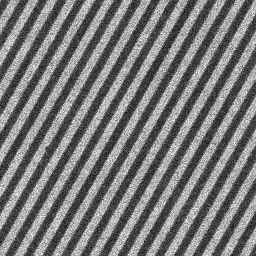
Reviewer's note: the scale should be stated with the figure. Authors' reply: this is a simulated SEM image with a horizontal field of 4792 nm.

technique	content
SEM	parallel lines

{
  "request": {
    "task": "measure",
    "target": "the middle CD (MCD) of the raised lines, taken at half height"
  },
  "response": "0.167 micrometres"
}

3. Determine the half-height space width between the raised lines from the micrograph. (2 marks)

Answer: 148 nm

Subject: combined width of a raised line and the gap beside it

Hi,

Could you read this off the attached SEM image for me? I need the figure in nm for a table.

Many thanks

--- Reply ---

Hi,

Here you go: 305